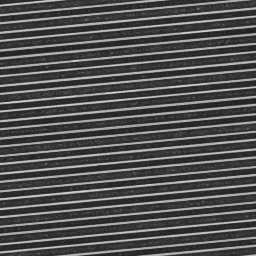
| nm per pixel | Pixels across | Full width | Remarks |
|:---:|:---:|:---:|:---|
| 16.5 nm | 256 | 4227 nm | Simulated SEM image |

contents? parallel lines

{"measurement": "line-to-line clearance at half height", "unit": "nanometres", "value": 113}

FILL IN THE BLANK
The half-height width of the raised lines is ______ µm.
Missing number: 0.0288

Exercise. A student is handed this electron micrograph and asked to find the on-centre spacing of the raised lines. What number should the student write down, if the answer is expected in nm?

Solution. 145